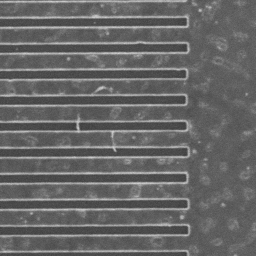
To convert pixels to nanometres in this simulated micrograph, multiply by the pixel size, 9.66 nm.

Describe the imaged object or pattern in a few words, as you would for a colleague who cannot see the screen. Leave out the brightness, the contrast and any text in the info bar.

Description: parallel lines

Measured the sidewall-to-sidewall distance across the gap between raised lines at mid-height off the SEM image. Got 89.4 nanometers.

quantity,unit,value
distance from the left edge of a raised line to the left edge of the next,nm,251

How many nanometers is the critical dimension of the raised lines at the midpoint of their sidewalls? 163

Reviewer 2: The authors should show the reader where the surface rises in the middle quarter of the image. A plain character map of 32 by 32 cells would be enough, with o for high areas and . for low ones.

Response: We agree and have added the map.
oooooooooooooooooooooooooooooooo
..............................oo
...............................o
...............................o
oooooooooooooooooooooooooooooooo
oooooooooooooooooooooooooooooooo
oooooooooooooooooooooooooooooooo
oooooooooooooooooooooooooooooooo
...............................o
...............................o
oooooooooooooooooooooooooooooooo
oooooooooooooooooooooooooooooooo
oooooooooooooooooooooooooooooooo
oooooooooooooooooooooooooooooooo
...o..........................oo
...............................o
..............................oo
oooooooooooooooooooooooooooooooo
oooooooooooooooooooooooooooooooo
oooooooooooooooooooooooooooooooo
oooooooooooooooooooooooooooooooo
...............................o
...............................o
oooooooooooooooooooooooooooooooo
oooooooooooooooooooooooooooooooo
oooooooooooooooooooooooooooooooo
oooooooooooooooooooooooooooooooo
..............................oo
...............................o
..............................oo
oooooooooooooooooooooooooooooooo
oooooooooooooooooooooooooooooooo